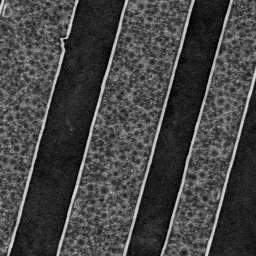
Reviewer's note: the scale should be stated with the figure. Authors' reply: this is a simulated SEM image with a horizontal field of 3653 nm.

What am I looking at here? one or a few lines or trenches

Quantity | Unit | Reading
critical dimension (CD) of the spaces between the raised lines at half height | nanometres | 600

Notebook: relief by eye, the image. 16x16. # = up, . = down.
#####...####..##
####....####..##
####...####...##
####...####...##
####...####..###
###...#####..###
###...####...##.
###...####..###.
###...####..###.
##...#####..###.
##...####...##..
##...####..###..
#....####..###..
#...####...###..
#...####...##...
#...####..###...